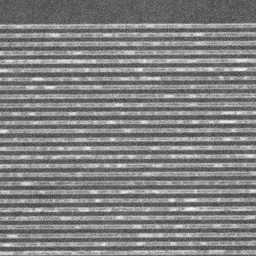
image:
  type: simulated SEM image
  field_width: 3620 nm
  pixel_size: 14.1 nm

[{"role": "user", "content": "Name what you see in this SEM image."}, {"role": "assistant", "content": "parallel lines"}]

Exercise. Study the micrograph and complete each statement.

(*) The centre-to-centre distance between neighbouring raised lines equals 8.72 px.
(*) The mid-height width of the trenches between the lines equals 77.8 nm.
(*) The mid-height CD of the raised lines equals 46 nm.